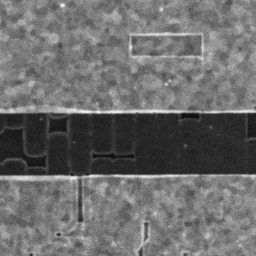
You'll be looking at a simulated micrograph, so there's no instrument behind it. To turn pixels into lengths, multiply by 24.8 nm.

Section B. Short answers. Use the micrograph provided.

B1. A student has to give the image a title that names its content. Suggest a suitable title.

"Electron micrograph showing wiring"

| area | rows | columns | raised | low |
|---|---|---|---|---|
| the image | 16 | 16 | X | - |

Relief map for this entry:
XXXXXXXXXXXXXXXX
XXXXXXXXXXXXXXXX
XXXXXXXX-----XXX
XXXXXXXXX---XXXX
XXXXXXXXXXXXXXXX
XXXXXXXXXXXXXXXX
XXXXXXXXXXXXXXXX
----------------
----------------
----------------
----------------
XXXXXXXXXXXXXXXX
XXXXXXXXXXXXXXXX
XXXXXXXXXXXXXXXX
XXXXXXXXXXXXXXXX
XXXXXXXXXXXXXXXX